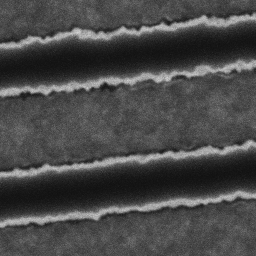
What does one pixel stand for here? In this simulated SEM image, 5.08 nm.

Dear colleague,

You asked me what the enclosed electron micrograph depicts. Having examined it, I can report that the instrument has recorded one or a few lines or trenches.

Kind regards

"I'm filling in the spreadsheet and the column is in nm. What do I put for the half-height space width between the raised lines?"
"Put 398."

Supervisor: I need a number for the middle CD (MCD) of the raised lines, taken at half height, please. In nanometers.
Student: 252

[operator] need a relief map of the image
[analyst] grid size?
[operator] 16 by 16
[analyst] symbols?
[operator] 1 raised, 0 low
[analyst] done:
0000000000000000
0000000000011111
0011111111111111
1111111111111111
1111111111111000
1111000000000000
0000000000000000
0000000000000000
0000000000000000
0000000000001111
0001111111111111
1111111111111111
1111111111111100
1111110000000000
0000000000000000
0000000000000000